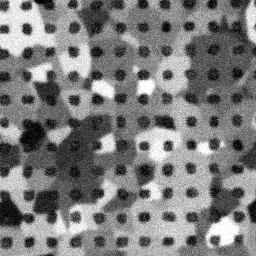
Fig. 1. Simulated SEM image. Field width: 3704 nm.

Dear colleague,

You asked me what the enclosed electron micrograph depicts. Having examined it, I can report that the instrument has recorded a regular array of holes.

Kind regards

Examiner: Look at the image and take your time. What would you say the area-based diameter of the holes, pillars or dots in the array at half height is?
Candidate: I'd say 175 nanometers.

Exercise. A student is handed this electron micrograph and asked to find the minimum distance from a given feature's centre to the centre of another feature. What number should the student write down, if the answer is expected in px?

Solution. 22.9